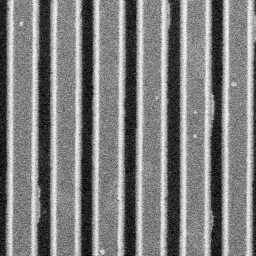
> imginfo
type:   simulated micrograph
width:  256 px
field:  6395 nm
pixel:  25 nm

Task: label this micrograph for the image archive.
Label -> lines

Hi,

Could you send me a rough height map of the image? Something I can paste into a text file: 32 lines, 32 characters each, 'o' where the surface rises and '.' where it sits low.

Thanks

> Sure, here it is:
.oooo..ooo..ooo..oooo..ooo..ooo.
.oooo..ooo..ooo..oooo..ooo..ooo.
.ooo...ooo..ooo..oooo..ooo..ooo.
.ooo...ooo..ooo..oooo..ooo..ooo.
.ooo...ooo..ooo..oooo..ooo..ooo.
.ooo...ooo..ooo..oooo..ooo..ooo.
.ooo...ooo..ooo..oooo..ooo..ooo.
.ooo...ooo..ooo..oooo..ooo..ooo.
.ooo...ooo..ooo..oooo..ooo..ooo.
.ooo...ooo..ooo..oooo..ooo..ooo.
.ooo...ooo..ooo..oooo..ooo..ooo.
.ooo...ooo..ooo..oooo..ooo..ooo.
.ooo...ooo..ooo..oooo..ooo..ooo.
.ooo...ooo..ooo..oooo..ooo..ooo.
.ooo...ooo..ooo..oooo..ooo..ooo.
.ooo...ooo..ooo..oooo..ooo..ooo.
.ooo...ooo..ooo..oooo..ooo..ooo.
.ooo...ooo..ooo..oooo..ooo..ooo.
.ooo...ooo..ooo..oooo..ooo..ooo.
.ooo...ooo..ooo..oooo..ooo..ooo.
.ooo...ooo..ooo..oooo..ooo..ooo.
.ooo...ooo..ooo..oooo..ooo..ooo.
.ooo...ooo..ooo..oooo..ooo..ooo.
.ooo...ooo..ooo..oooo..ooo..ooo.
.ooo...ooo..ooo..ooo...ooo..ooo.
.ooo...ooo..ooo..ooo...ooo..ooo.
.ooo...ooo..ooo..ooo...ooo..ooo.
.ooo...ooo..ooo..ooo...ooo..ooo.
.ooo...ooo..ooo..ooo...ooo..ooo.
.ooo...ooo..ooo..ooo...ooo..ooo.
.ooo...ooo..ooo..ooo...ooo..ooo.
.ooo...ooo..ooo..ooo...ooo..ooo.